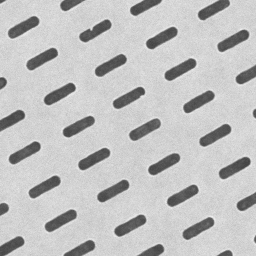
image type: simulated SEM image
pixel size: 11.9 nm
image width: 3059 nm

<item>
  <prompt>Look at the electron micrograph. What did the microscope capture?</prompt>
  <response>a regular array of holes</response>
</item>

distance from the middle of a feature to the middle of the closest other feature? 443 nanometres